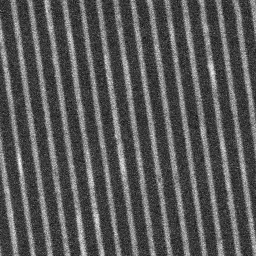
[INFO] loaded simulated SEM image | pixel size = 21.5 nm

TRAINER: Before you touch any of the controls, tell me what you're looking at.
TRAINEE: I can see parallel lines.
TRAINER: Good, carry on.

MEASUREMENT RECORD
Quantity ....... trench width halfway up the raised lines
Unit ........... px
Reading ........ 12.7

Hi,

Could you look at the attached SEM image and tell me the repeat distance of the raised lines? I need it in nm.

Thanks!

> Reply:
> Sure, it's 365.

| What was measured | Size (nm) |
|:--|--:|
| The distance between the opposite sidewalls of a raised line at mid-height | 93.1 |